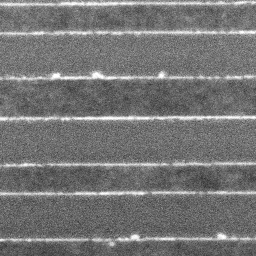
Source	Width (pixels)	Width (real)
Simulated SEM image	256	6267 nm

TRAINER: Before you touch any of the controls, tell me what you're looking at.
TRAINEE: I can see lines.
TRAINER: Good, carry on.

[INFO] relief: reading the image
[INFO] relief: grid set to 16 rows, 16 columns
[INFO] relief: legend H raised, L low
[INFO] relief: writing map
HHHHHHHHHHHHHHHH
HHHHHHHHHHHHHHHH
LLLLLLLLLLLLLLLL
LLLLLLLLLLLLLLLL
LLLLLLLLLLLLLLLL
HHHHHHHHHHHHHHHH
HHHHHHHHHHHHHHHH
LLLLLLLLLLLLLLLL
LLLLLLLLLLLLLLLL
LLLLLLLLLLLLLLLL
HHHHHHHHHHHHHHHH
HHHHHHHHHHHHHHHH
LLLLLLLLLLLLLLLL
LLLLLLLLLLLLLLLL
LLLLLLLLLLLLLLLL
HHHHHHHHHHHHHHHH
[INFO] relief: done